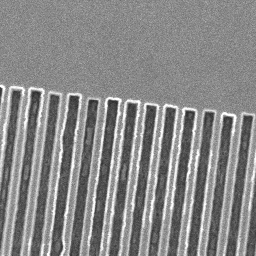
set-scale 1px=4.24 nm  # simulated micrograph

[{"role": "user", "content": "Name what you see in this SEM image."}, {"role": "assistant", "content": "parallel lines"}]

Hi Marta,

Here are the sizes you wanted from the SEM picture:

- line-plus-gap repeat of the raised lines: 82.2 nm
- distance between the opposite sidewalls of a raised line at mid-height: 0.0373 µm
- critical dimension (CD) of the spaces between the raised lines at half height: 44.6 nm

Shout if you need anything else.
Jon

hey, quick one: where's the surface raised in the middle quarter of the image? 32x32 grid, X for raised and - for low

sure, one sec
XXXXXXXXXXXXXXXXXXXXXXXXXXXXXXXX
XXXXXXXXXXXXXXXXXXXXXXXXXXXXXXXX
XXXXXXXXXXXXXXXXXXXXXXXXXXXXXXXX
XXXXXXXXXXXXXXXXXXXXXXXXXXXXXXXX
XXXXXXXXXXXXXXXXXXXXXXXXXXXXXXXX
XXXXXXXXXXXXXXXXXXXXXXXXXXXXXXXX
XXXXXXXXXXXXXXXXXXXXXXXXXXXXXXXX
XXXXXXXXXXXXXXXXXXXXXXXXXXXXXXXX
X---XXXXXXXXXXXXXXXXXXXXXXXXXXXX
X---XX---XX---XXXXXXXXXXXXXXXXXX
X---XX---XX---XX--XXX--XXXXXXXXX
X---XX--XXX---XX--XX---XX---XXXX
X---XX--XXX--XX---XX---XX---XX--
X--XXX--XX---XX---XX---XX---XX--
---XX---XX---XX---XX---XX---XX--
---XX---XX---XX---XX---XX---XX--
---XX---XX---XX---XX---XX---XX--
---XX---XX---XX---XX--XXX--XX---
---XX---XX---XX---XX--XX---XX---
--XXX--XXX---XX--XXX--XX---XX---
--XXX--XXX--XX---XX---XX---XX---
--XXX--XX---XX---XX---XX---XX---
--XX---XX---XX---XX---XX---XX---
--XX---XX---XX---XX---XX--XXX---
--XX---XX---XX---XX--XXX--XXX--X
--XX---XX---XX---XX--XXX--XX---X
--XX---XX---XX--XXX--XX---XX---X
--XX--XXX--XXX--XX---XX---XX---X
-XXX--XXX--XX---XX---XX---XX---X
-XXX--XX---XX---XX---XX---XX---X
-XX---XX---XX---XX---XX---XX---X
-XX---XX---XX---XX---XX---XX--XX